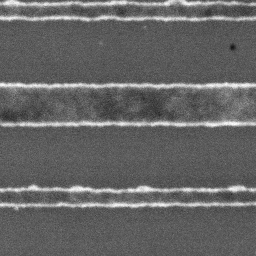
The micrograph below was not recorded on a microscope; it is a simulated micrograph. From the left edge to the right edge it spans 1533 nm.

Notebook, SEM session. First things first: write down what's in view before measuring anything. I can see lines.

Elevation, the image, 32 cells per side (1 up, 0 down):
11101111111111111111111111111111
11111111111111111111111111111111
00000000000100000000000000000000
00000000000000000000000000000000
00000000000000000000000000000000
00000000000000000000000000000000
00000000000000000000000000000000
00000000000000000000000000000000
00000000000000000000000000000000
00000000000000000000000000000000
00000000000000000000000000000000
11111111111111111111111111111111
11111111111111111111111111111111
11111111111111111111111111111111
11111111111111111111111111111111
11111111111111111111111111111111
00000000000000000000000000000000
00000000000000000000000000000000
00000000000000000000000000000000
00000000000000000000000000000000
00000000000000000000000000000000
00000000000000000000000000000000
00000000000000000000000000000000
00000000000000000000000000000100
11111111111111111111111111111111
11111111111111111111111111111111
00000000000000000000000000000000
00000000000000000000000000000000
00000000000000000000000000000000
00000000000000000000000000000000
00000000000000000000000000000000
00000000000000000000000000000000